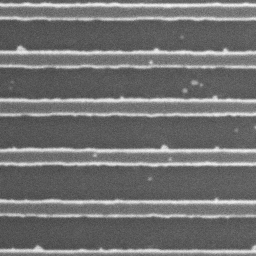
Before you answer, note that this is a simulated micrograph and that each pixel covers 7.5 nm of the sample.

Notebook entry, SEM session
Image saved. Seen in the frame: lines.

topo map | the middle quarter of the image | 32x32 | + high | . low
++++++++++++++++++++++++++++++++
................................
................................
................................
................................
................................
................................
................................
................................
++++++++++++++++++++++++++++++++
++++++++++++++++++++++++++++++++
++++++++++++++++++++++++++++++++
++++++++++++++++++++++++++++++++
................................
................................
................................
................................
................................
................................
................................
................................
+++++++++..+++++++++...+++++++++
++++++++++++++++++++++++++++++++
++++++++++++++++++++++++++++++++
++++++++++++++++++++++++++++++++
................................
................................
................................
................................
................................
................................
................................